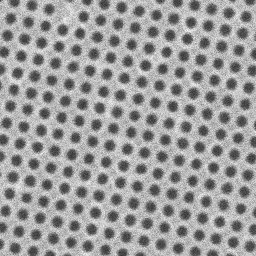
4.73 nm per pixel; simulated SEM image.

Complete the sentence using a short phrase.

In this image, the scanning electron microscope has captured a regular array of holes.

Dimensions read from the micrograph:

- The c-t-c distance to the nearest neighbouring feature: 80.6 nanometers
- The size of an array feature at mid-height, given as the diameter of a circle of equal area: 52.5 nanometers